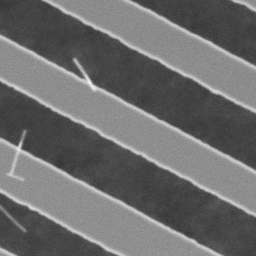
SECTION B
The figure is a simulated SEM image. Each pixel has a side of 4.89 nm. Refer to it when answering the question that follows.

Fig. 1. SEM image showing lines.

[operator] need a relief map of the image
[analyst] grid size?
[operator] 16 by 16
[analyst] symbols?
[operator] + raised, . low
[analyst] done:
....+++++.......
.....++++++.....
+......++++++...
++.......++++++.
++++.......+++++
.+++++.......+++
...+++++.......+
.....+++++......
......++++++....
++......++++++..
++++......++++++
+++++.......++++
.++++++.......++
...++++++.......
.....++++++.....
......+++++++...